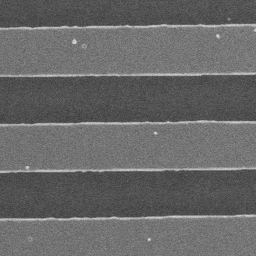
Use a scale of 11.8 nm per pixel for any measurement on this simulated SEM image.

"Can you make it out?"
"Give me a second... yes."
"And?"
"lines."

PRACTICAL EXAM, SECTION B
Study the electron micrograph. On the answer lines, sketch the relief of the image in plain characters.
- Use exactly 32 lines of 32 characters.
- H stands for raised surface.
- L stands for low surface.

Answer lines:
LLLLLLLLLLLLLLLLLLLLLLLLLLLLLLLL
LLLLLLLLLLLLLLLLLLLLLLLLLLLLLLLL
LLLLLLLLLLLLLLLLLLLLLLLLLLLLLLLL
LLHHHHHHHHHHHHHHHHHHHHHHHHHHHHHH
HHHHHHHHHHHHHHHHHHHHHHHHHHHHHHHH
HHHHHHHHHHHHHHHHHHHHHHHHHHHHHHHH
HHHHHHHHHHHHHHHHHHHHHHHHHHHHHHHH
HHHHHHHHHHHHHHHHHHHHHHHHHHHHHHHH
HHHHHHHHHHHHHHHHHHHHHHHHHHHHHHHH
HHHHHHHHHHHLLLLLLLLLLLLLLLLLLLLL
LLLLLLLLLLLLLLLLLLLLLLLLLLLLLLLL
LLLLLLLLLLLLLLLLLLLLLLLLLLLLLLLL
LLLLLLLLLLLLLLLLLLLLLLLLLLLLLLLL
LLLLLLLLLLLLLLLLLLLLLLLLLLLLLLLL
LLLLLLLLLLLLLLLLLLLLLLLLLLLLLLLL
LLHLHHHHHHHHHHHHHHHHHHHHHHHHHHHH
HHHHHHHHHHHHHHHHHHHHHHHHHHHHHHHH
HHHHHHHHHHHHHHHHHHHHHHHHHHHHHHHH
HHHHHHHHHHHHHHHHHHHHHHHHHHHHHHHH
HHHHHHHHHHHHHHHHHHHHHHHHHHHHHHHH
HHHHHHHHHHHHHHHHHHHHHHHHHHHHHHHH
HHLLLLLLLLLLLLLLLLLLLLLLLLLLLLLL
LLLLLLLLLLLLLLLLLLLLLLLLLLLLLLLL
LLLLLLLLLLLLLLLLLLLLLLLLLLLLLLLL
LLLLLLLLLLLLLLLLLLLLLLLLLLLLLLLL
LLLLLLLLLLLLLLLLLLLLLLLLLLLLLLLL
LLLLLLLLLLLLLLLLLLLLLLLLLLLLLLLL
HHHHHHHHHHHHHHHHHHHHHHHHHHHHHHHH
HHHHHHHHHHHHHHHHHHHHHHHHHHHHHHHH
HHHHHHHHHHHHHHHHHHHHHHHHHHHHHHHH
HHHHHHHHHHHHHHHHHHHHHHHHHHHHHHHH
HHHHHHHHHHHHHHHHHHHHHHHHHHHHHHHH